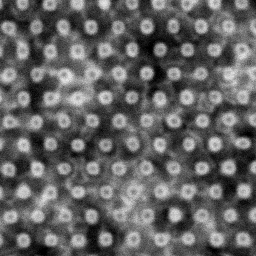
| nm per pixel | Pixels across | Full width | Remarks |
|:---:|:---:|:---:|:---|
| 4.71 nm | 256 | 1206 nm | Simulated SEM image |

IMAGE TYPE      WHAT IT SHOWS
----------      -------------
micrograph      a regular array of raised bodies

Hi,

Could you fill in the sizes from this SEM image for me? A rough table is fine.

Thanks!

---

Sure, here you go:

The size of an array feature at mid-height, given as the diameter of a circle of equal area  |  55.8 nanometres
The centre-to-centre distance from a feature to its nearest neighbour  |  26.7 px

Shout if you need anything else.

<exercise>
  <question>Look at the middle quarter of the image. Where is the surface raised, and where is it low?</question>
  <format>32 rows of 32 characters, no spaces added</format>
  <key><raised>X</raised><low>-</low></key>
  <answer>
--------------------------------
X-----XX----XXX-----XX----XXX---
XX----XX----XXX----XXX----XXX---
XX----XX-----XX-----XX-----XX---
--------------------------------
--------------------------------
--------------------------------
---XX----XXX----XX-----XX----XXX
--XXX----XXX----XX-----XX----XXX
---XX----XXX----XX-----XX-----XX
--------------------------------
--------------------------------
--------------------------------
X-----XX-----XX----XXX----XXX---
X-----XX-----XX----XXX----XXX---
X-----XX-----XX------------X----
--------------------------------
--------------------------------
--------------------------------
--XXX----XXX----XX-----XX-----XX
--XXX----XXX----XX-----XX-----XX
----------X------------XX-------
--------------------------------
--------------------------------
--------------------------------
X-----XXX---XXX----XXX----XXX---
XX----XXX---XXX----XXX----XXX---
-------X-----XX-----------------
--------------------------------
--------------------------------
------------------------------XX
--XXX----XXX----XXX----XX----XXX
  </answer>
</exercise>